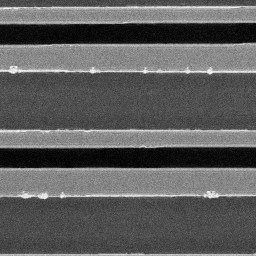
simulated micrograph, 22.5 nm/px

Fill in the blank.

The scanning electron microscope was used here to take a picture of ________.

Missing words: lines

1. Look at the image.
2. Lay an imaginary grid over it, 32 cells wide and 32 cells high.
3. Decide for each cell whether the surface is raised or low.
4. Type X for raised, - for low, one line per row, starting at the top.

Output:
--------------------------------
XXXXXXXXXXXXXXXXXXXXXXXXXXXXXXXX
XXXXXXXXXXXXXXXXXXXXXXXXXXXXXXXX
--------------------------------
--------------------------------
-----------------------------XXX
XXXXXXXXXXXXXXXXXXXXXXXXXXXXXXXX
XXXXXXXXXXXXXXXXXXXXXXXXXXXXXXXX
XXXXXXXXXXXXXXXXXXXXXXXXXXXXXXXX
--------------------------------
--------------------------------
--------------------------------
--------------------------------
--------------------------------
--------------------------------
--------------------------------
XXXXXXXXXXXXXXXXXXXXXXXXXXXXXXXX
XXXXXXXXXXXXXXXXXXXXXXXXXXXXXXXX
--------------------------------
--------------------------------
--------------------------------
XXXXXXXXXXXXXXXXXXXXXXXXXXXXXXXX
XXXXXXXXXXXXXXXXXXXXXXXXXXXXXXXX
XXXXXXXXXXXXXXXXXXXXXXXXXXXXXXXX
--XXXX-XX-----------------X-----
--------------------------------
--------------------------------
--------------------------------
--------------------------------
--------------------------------
--------------------------------
--------------------------------